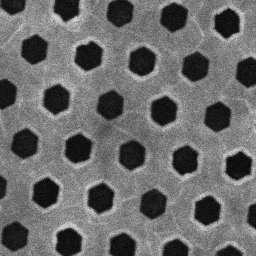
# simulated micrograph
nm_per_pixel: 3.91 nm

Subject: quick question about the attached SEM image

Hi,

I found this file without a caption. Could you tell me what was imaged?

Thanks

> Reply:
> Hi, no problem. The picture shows a regular array of holes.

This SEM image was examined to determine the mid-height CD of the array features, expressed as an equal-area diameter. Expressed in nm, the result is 111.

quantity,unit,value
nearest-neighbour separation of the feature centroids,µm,0.209